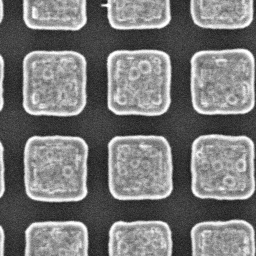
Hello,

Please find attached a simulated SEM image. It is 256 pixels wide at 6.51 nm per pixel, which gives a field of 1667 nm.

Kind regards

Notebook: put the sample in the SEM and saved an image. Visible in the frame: raised bodies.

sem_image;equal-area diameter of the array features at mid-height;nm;447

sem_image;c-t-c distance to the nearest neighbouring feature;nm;547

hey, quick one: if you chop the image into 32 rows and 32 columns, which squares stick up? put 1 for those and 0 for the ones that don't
00011111111001111111100011111111
00011111111000111111100011111111
00011111111000111111100011111110
00000010110000011000000000000000
00000000000000000000000000000000
00000000000000000000000000000000
00000000000000011111000000011110
00011111110000111111100011111111
00011111111000111111100011111111
00011111111000111111100011111111
00011111111000111111100011111111
00011111111000111111100011111111
00011111111000111111100011111111
00011111110000111111100011111110
00000000000000000000000000000000
00000000000000000000000000000000
00000000000000000000000000000000
00001111110000111111100001111110
00011111111000111111100011111111
00011111111000111111100011111111
00011111111000111111100011111111
00011111111000111111100011111111
00011111111000111111100011111111
00011111111000111111100011111111
00001111110000111111100001111110
00000000000000000000000000000000
00000000000000000000000000000000
00000000000000000000000000000000
00001111111000111111100011111111
00011111111000111111100011111111
00011111111000111111100011111111
00011111111000111111100011111111